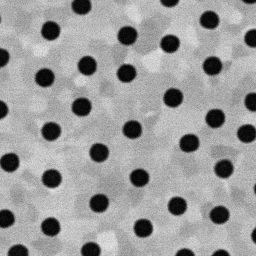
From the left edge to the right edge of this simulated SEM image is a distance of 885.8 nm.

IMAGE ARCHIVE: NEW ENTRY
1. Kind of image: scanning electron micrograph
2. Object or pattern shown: a regular array of holes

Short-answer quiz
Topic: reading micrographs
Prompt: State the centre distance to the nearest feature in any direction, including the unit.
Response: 0.149 µm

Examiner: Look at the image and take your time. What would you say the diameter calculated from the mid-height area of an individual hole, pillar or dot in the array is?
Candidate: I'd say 68.6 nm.